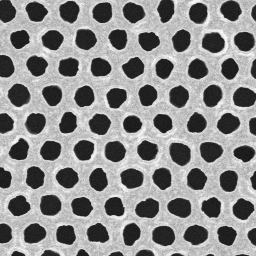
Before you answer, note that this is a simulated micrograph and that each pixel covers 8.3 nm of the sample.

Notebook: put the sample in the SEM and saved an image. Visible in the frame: a regular array of holes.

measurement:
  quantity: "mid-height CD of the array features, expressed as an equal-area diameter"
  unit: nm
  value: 168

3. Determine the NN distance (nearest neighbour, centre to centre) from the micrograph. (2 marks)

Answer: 258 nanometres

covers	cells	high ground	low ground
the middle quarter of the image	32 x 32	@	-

----@@@-----@@@-----@@@----@@@@-
----@@@-----@@@-----@@@----@@@@-
---@@@@----@@@@----@@@@----@@@@-
@@@@@@@@@@@@@@@@@@@@@@@@--@@@@@@
@@@@@@@@@@@@@@@@@@@@@@@@@@@@@@@@
@@@@@-@@@@@@@@@@@@@@--@@@@@@@@@@
@@@----@@@@----@@@@----@@@@----@
@@@----@@@@-----@@@----@@@-----@
@@@-----@@@-----@@@----@@@@----@
@@@----@@@@----@@@@----@@@@----@
@@@@--@@@@@---@@@@@@-@@@@@@@--@@
@@@@@@@@@@@@@@@@@@@@@@@@@@@@@@@@
--@@@@@@--@@@@@@@@@@@@@@@@@@@@@@
---@@@@----@@@@----@@@@----@@@@-
---@@@------@@@----@@@-----@@@@-
---@@@------@@@----@@@@----@@@@-
---@@@@----@@@@----@@@@@--@@@@@-
-@@@@@@@--@@@@@@@@@@@@@@@@@@@@@@
@@@@@@@@@@@@@@@@@@@@@@@@@@@@@@@@
@@@@---@@@@@--@@@@@@-@@@@@@@@@@@
@@@-----@@-----@@@-----@@@@----@
@@@-----@@-----@@@-----@@@------
@@@----@@@-----@@@@----@@@@-----
@@@----@@@@----@@@@----@@@@----@
@@@@@@@@@@@@-@@@@@@@@@@@@@@@---@
@@@@@@@@@@@@@@@@@@@@@@@@@@@@@@@@
---@@@@---@@@@@@--@@@@@---@@@@@@
---@@@@----@@@------@@-----@@@@-
----@@-----@@@------@@-----@@@@-
---@@@-----@@@------@@-----@@@@-
--@@@@@----@@@@----@@@@---@@@@@-
@@@@@@@@--@@@@@@@@@@@@@@@@@@@@@@